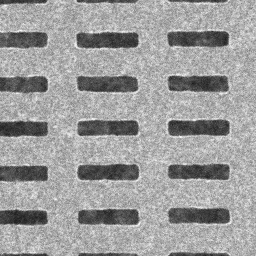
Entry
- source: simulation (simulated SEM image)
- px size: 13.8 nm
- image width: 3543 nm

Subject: a regular array of holes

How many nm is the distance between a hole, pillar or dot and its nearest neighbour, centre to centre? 608